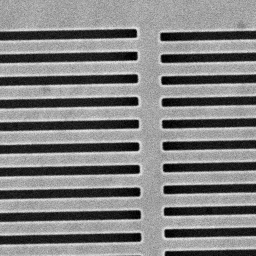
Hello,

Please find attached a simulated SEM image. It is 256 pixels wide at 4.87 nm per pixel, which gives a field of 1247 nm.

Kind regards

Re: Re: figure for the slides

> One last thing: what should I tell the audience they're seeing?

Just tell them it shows groups of lines, slits or small figures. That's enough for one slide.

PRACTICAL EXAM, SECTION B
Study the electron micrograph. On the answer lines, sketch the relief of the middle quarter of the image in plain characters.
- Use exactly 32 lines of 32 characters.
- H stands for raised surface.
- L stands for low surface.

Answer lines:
HHHHHHHHHHHHHHHHHHHHHHHHHHHHHHHH
HHHHHHHHHHHHHHHHHHHHHHHHHHHHHHHH
HHHHHHHHHHHHLLLLLLHHHHHHHHHHHHHH
LLLLLLLLLLLLLLLLLLLHHHHHLLLLLLLL
LLLLLLLLLLLLLLLLLLLHHHHHLLLLLLLL
HHHHHHHHHHHHHHHHHHHHHHHHHHHHHHHH
HHHHHHHHHHHHHHHHHHHHHHHHHHHHHHHH
HHHHHHHHHHHHHHHHHHHHHHHHHHHHHHHH
LLLLLLLLLLLLLLLLLLHHHHHHHLLLLLLL
LLLLLLLLLLLLLLLLLLLHHHHHLLLLLLLL
LLLLLLLLLLLLLLLLLLHHHHHHHLLLLLLL
HHHHHHHHHHHHHHHHHHHHHHHHHHHHHHHH
HHHHHHHHHHHHHHHHHHHHHHHHHHHHHHHH
HHHHHHHHHHHHHHHHHHHHHHHHHHHHHHHH
LLLLLLLLLLLLLLLLLLLHHHHHLLLLLLLL
LLLLLLLLLLLLLLLLLLLHHHHHLLLLLLLL
LLLLLHHHHHHHHHHHHHHHHHHHHHHHHHHH
HHHHHHHHHHHHHHHHHHHHHHHHHHHHHHHH
HHHHHHHHHHHHHHHHHHHHHHHHHHHHHHHH
HHHHHHHHHLLLLLLLLLHHHHHHHLLLLLLL
LLLLLLLLLLLLLLLLLLLHHHHHHLLLLLLL
LLLLLLLLLLLLLLLLLLLHHHHHHLLLLLLL
HHHHHHHHHHHHHHHHHHHHHHHHHHHHHHHH
HHHHHHHHHHHHHHHHHHHHHHHHHHHHHHHH
HHHHHHHHHHHHHHHHHHHHHHHHHHHHHHHH
LLLLLLLLLLLLLLLLLLLHHHHHHLLLLLLL
LLLLLLLLLLLLLLLLLLLHHHHHHLLLLLLL
LLLLLLLLLLLLLLLLLLLHHHHHHHHHHHHH
HHHHHHHHHHHHHHHHHHHHHHHHHHHHHHHH
HHHHHHHHHHHHHHHHHHHHHHHHHHHHHHHH
HHHHHHHHHHHHHHHHHHHHHHHHHLLLLLLL
LLLLLLLLLLLLLLLLLLLHHHHHHLLLLLLL